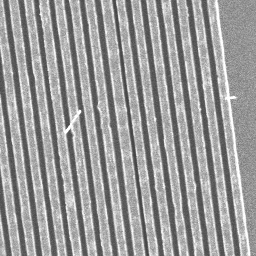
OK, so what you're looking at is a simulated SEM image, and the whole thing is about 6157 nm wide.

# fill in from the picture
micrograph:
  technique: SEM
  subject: parallel lines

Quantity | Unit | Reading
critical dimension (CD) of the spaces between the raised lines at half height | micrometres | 0.14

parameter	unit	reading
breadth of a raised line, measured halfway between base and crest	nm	212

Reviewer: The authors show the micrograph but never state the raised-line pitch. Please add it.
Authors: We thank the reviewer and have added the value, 0.364 um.